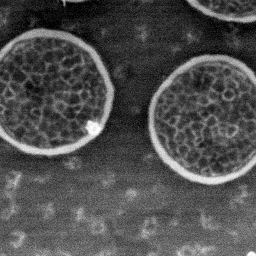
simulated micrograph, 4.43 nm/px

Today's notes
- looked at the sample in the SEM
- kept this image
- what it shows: raised bodies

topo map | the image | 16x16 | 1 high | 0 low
0000000000000111
0000000000000000
0111100000000000
1111110000000000
1111110000011110
1111111000111111
1111111000111111
1111111001111111
1111110000111111
0000000000111111
0000000000011110
0000000000000000
0000000000000000
0000000000000000
0000000000000000
0000000000000000